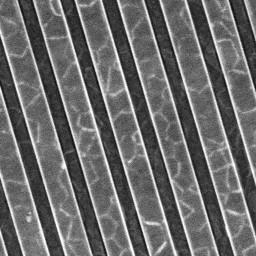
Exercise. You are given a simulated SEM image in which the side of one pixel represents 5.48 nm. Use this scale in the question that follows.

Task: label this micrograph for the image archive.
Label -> parallel lines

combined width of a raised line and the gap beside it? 0.222 µm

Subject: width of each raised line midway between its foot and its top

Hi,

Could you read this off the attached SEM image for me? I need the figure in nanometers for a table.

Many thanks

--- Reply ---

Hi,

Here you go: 141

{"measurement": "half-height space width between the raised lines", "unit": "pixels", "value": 15.1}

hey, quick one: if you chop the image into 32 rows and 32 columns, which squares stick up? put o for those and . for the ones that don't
oo..oooo..ooo..ooo..ooo..oooo..o
ooo..ooo..ooo..ooo..oooo..ooo..o
ooo..ooo..ooo..oooo..ooo..ooo..o
ooo..ooo..oooo..ooo..ooo..oooo..
oooo.oooo..ooo..ooo..oooo..ooo..
oooo..ooo..ooo..oooo..ooo..ooo..
.ooo..ooo..oooo..ooo..ooo..ooo..
.ooo..oooo..ooo..ooo..ooo..oooo.
.oooo..ooo..ooo..ooo..oooo..ooo.
..ooo..ooo..ooo..oooo..ooo..ooo.
..ooo..oooo.oooo..ooo..ooo..oooo
..oooo..ooo..ooo..ooo..oooo..ooo
o..ooo..ooo..ooo..oooo..ooo..ooo
o..ooo..ooo..oooo..ooo..ooo..ooo
o..ooo..oooo..ooo..ooo..ooo..ooo
o..oooo..ooo..ooo..oooo..ooo..oo
oo..ooo..ooo..ooo..oooo..ooo..oo
oo..ooo..oooo..ooo..ooo..ooo..oo
oo..oooo..ooo..ooo..ooo..oooo..o
ooo..ooo..ooo..ooo..oooo..ooo..o
ooo..ooo..ooo..oooo..ooo..ooo..o
ooo..oooo.oooo..ooo..ooo..oooo..
ooo..oooo..ooo..ooo..oooo..ooo..
.ooo..ooo..ooo..oooo..ooo..ooo..
.ooo..ooo..oooo..ooo..ooo..ooo..
.ooo..oooo..ooo..ooo..ooo..oooo.
.oooo..ooo..ooo..ooo..oooo..ooo.
..ooo..ooo..ooo..oooo..ooo..ooo.
..ooo..oooo.oooo..ooo..ooo..oooo
..oooo.oooo..ooo..ooo..oooo..ooo
...ooo..ooo..ooo..oooo..ooo..ooo
o..ooo..ooo..oooo..ooo..ooo..ooo